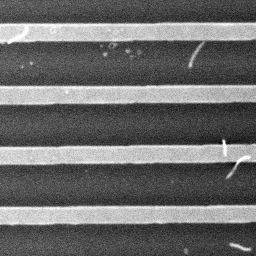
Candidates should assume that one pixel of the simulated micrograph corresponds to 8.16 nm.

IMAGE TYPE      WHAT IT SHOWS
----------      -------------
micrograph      lines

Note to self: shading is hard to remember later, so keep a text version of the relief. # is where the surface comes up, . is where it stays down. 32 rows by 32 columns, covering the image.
................................
................................
................................
################################
################################
................................
................................
................................
................................
................................
................................
################################
################################
................................
................................
................................
................................
................................
################################
################################
................................
................................
................................
................................
................................
................................
################################
################################
................................
................................
................................
................................